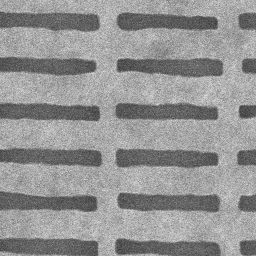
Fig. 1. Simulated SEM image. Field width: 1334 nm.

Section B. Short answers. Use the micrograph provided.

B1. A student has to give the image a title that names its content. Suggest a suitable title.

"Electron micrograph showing holes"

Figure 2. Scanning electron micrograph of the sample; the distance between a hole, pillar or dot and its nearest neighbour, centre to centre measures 0.238 µm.